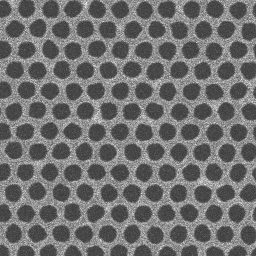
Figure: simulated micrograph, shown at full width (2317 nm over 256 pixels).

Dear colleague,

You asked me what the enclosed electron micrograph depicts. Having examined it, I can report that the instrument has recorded a regular array of holes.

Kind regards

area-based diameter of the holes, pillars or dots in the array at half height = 161 nm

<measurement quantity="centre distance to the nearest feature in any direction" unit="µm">0.206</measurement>